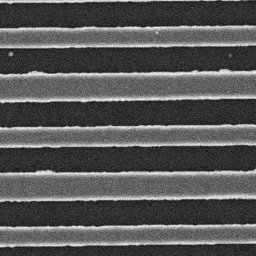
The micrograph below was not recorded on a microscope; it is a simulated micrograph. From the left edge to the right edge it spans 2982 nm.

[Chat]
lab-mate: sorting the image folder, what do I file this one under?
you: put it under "lines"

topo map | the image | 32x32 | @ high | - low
--------------------------------
--------------------------------
--------------------------------
----------@@--@@@@@@@@@@@@@@@@@@
@@@@@@@@@@@@@@@@@@@@@@@@@@@@@@@@
@@@@@@@@@@@@@@@@@@@@@@@@@@@@@@@@
--------------------------------
--------------------------------
--------------------------------
@@@@@@@@@@@@@@@@@@@@@@@@@@@@@@@@
@@@@@@@@@@@@@@@@@@@@@@@@@@@@@@@@
@@@@@@@@@@@@@@@@@@@@@@@@@@@@@@@@
@@@@@@@@@@@@@-------------------
--------------------------------
--------------------------------
--------------------------------
@@@@@@@@@@@@@@@@@@@@@@@@@@@@@@@@
@@@@@@@@@@@@@@@@@@@@@@@@@@@@@@@@
--------------------------------
--------------------------------
--------------------------------
--------------------------------
@@@@@@@@@@@@@@@@@@@@@@@@@@@@@@@@
@@@@@@@@@@@@@@@@@@@@@@@@@@@@@@@@
@@@@@@@@@@@@@@@@@@@@@@@@@@@@@@@@
--------------------------------
--------------------------------
--------------------------------
@@@@@@@@@@@@@@@@@@@@@@@@@@@@@@@@
@@@@@@@@@@@@@@@@@@@@@@@@@@@@@@@@
@@@@@@@@@@@@@@@@@@--------------
--------------------------------